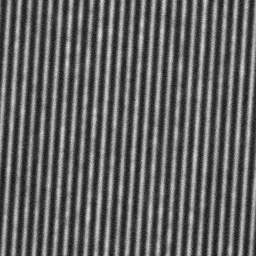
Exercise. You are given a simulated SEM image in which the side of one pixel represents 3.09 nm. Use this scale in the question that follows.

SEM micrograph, parallel lines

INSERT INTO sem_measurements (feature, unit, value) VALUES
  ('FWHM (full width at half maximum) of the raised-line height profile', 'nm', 5.8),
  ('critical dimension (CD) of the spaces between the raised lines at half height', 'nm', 25.8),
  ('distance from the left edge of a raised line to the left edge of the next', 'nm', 31.8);